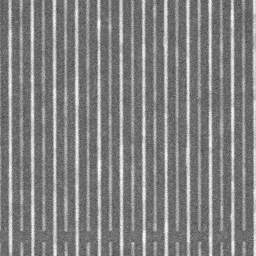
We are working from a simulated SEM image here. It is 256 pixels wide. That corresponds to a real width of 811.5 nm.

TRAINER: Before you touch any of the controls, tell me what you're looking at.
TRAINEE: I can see parallel lines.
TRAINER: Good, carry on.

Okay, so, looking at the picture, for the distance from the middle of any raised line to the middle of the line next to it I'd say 35.2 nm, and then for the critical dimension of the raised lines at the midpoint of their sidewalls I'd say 1.99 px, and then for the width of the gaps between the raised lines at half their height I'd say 29.7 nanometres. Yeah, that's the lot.